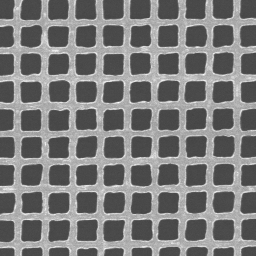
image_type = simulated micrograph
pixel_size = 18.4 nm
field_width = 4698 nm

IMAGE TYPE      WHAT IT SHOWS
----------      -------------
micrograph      a regular array of holes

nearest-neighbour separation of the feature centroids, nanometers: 497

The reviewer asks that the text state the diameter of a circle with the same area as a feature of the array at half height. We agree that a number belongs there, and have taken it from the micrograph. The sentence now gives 0.425 µm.